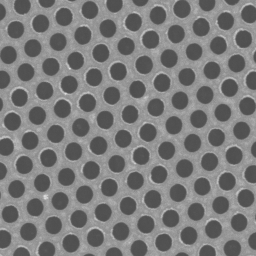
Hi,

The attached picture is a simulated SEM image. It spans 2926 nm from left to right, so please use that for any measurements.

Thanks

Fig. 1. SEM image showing a regular array of holes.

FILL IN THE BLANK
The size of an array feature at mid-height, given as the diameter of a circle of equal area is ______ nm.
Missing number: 201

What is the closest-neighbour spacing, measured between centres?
286 nm